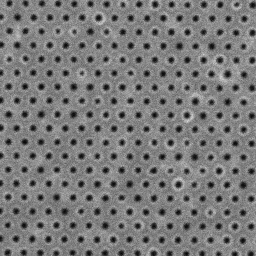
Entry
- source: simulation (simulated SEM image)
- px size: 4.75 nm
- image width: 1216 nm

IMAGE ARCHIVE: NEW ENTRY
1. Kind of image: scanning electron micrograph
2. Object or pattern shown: a regular array of holes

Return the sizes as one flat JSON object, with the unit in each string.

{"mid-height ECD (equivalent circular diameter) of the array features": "0.0308 µm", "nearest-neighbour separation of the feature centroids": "74.2 nanometers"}